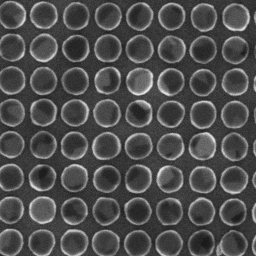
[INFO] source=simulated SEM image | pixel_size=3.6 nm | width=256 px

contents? a regular array of raised bodies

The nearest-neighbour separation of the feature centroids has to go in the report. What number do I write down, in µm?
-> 0.114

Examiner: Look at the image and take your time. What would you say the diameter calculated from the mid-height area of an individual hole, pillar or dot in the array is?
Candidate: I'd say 96.7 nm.